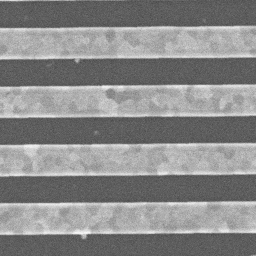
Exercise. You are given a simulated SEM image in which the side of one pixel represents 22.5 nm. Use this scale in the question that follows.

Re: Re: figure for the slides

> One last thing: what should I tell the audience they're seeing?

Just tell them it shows wiring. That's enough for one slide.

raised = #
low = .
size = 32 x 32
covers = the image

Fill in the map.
................................
................................
................................
.............................###
################################
################################
################################
................................
................................
................................
................................
################################
################################
################################
###.............................
................................
................................
................................
################################
################################
################################
################################
................................
................................
................................
........................########
################################
################################
################################
................................
................................
................................